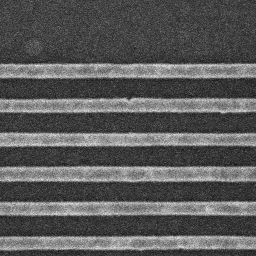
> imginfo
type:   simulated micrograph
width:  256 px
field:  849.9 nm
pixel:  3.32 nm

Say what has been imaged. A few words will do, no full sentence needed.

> parallel lines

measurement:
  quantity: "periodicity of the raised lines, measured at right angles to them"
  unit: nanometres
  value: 114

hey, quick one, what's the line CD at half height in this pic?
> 43.1 nm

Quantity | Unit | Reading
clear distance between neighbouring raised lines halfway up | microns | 0.0709